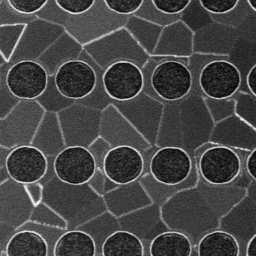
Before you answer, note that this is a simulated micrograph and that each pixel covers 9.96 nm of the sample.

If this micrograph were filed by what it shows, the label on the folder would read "a regular array of holes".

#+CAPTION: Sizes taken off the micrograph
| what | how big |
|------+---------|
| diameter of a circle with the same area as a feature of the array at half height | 376 nanometers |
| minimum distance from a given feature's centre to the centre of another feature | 48.2 px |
